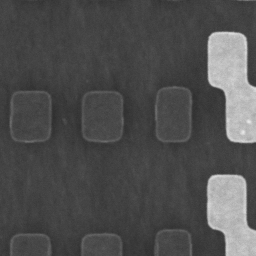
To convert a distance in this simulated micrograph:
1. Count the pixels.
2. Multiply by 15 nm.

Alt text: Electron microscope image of wiring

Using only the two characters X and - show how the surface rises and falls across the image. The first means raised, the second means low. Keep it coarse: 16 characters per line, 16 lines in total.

----------------
----------------
-------------XX-
-------------XX-
-------------XX-
----------X---XX
-XX--XXX--XX--XX
-XX--XXX--XX--XX
-XX--XX---XX--XX
----------------
----------------
-------------XX-
-------------XX-
-------------XX-
----------XX--XX
-XX--XXX--XX--XX